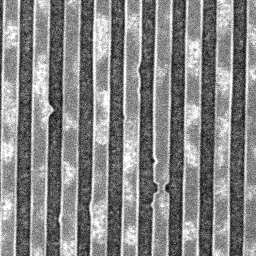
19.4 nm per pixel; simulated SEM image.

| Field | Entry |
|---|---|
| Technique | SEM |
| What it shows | parallel lines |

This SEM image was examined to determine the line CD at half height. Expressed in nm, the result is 304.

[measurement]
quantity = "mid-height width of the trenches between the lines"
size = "287 nanometers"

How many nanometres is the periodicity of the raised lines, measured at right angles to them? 592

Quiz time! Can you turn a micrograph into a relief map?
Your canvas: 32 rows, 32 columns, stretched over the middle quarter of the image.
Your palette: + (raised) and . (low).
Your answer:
++++....+++....++++....++++....+
++++....+++....+++.....++++....+
++++....+++....++++....++++....+
++++....+++....++++....++++....+
++++....+++....++++....+++.....+
++++....+++....++++....++++....+
++++....+++....++++....++++...++
++++....+++....++++....++++...++
++++....+++....++++....++++...++
++++....+++....++++....++++...++
+++.....+++....++++....+++....++
+++.....+++....++++....+++....++
+++.....+++....++++....+++....++
+++.....+++....++++....+++....++
+++.....+++....++++....+++....++
+++.....+++....++++....+++....++
+++.....+++....++++....+++....++
+++.....+++....++++...++++....++
+++.....+++....++++...++++....++
+++....++++....++++...++++....++
+++....++++....++++...++++....++
+++....++++....++++....+++....++
+++....++++....+++.....+++....++
+++....++++....+++.....+++....++
+++....++++....+++.....+++....++
+++....++++....+++.....+++....++
+++....++++....+++.....+++....++
+++....++++....+++.....+++....++
+++....++++....+++.....+++....++
+++....++++....+++.....+++....++
+++....++++....+++......+.....++
+++....++++....+++......+.....++